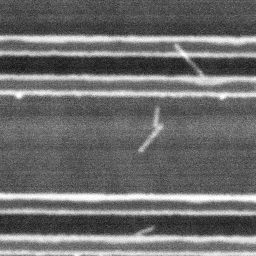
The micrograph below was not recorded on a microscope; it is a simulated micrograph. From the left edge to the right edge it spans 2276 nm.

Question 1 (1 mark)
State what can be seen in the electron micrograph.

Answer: lines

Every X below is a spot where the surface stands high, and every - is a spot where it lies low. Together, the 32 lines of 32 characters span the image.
--------------------------------
--------------------------------
--------------------------------
--------------------------------
--------------------------------
XXXXXXXXXXXXXXXXXXXXXXXXXXXXXXXX
XXXXXXXXXXXXXXXXXXXXXXXXXXXXXXXX
--------------------------------
--------------------------------
--------------------------------
XXXXXXXXXXXXXXXXXXXXXXXXXXXXXXXX
XXXXXXXXXXXXXXXXXXXXXXXXXXXXXXXX
--------------------------------
--------------------------------
--------------------------------
--------------------------------
--------------------------------
--------------------------------
--------------------------------
--------------------------------
--------------------------------
--------------------------------
--------------------------------
--------------------------------
XXXXXXX-X-------XX--------------
XXXXXXXXXXXXXXXXXXXXXXXXXXXXXXXX
XXXXXXXXXXXXXXXXXXXXXXXXXXXXXXXX
--------------------------------
--------------------------------
--------------------------------
XXXXXXXXXXXXXXXXXXXXXXXXXXXXXXXX
XXXXXXXXXXXXXXXXXXXXXXXXXXXXXXXX